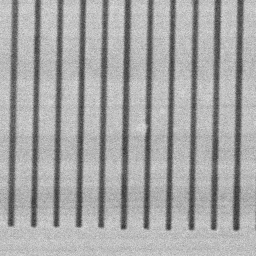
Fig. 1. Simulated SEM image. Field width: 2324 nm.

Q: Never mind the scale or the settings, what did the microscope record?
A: parallel lines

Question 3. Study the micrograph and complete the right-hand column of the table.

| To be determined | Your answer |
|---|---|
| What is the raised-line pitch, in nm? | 204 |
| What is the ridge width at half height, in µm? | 0.146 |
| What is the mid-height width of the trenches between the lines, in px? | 6.62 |